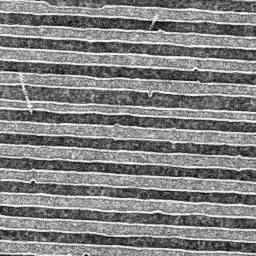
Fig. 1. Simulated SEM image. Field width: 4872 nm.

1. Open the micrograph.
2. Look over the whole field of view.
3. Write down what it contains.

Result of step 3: parallel lines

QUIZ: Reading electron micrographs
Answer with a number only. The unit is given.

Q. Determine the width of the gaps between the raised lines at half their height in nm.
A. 235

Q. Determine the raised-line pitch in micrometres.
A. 0.457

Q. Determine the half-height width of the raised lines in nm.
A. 218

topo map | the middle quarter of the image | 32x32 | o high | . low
................oooooooooooooooo
................................
................................
ooooooo.........................
oooooooooooooooooooooooooooooo..
oooooooooooooooooooooooooooooooo
..................oooooooooooooo
.....................o......oooo
................................
................................
oooooooooooooo..................
oooooooooooooooooooooooooooooooo
..........oo....oooooooooooooooo
................................
................................
oooooooo.o..oo..................
oooooooooooooooooooooooooooo....
oooooooooooooooooooooooooooooooo
............oooooooooooooooooooo
...........................o.oo.
................................
oooooooo........................
oooooooooooooooooooooooo....oo..
oooooooooooooooooooooooooooooooo
............oooooooooooooooooooo
.............................ooo
................................
ooooooooooo.....................
ooooooooooooooooooooooooooo..oo.
oooooooooooooooooooooooooooooooo
...........ooooooooooooooooooooo
.............................ooo